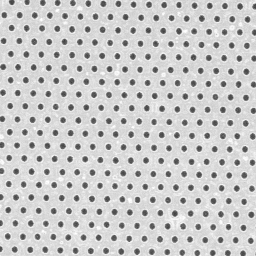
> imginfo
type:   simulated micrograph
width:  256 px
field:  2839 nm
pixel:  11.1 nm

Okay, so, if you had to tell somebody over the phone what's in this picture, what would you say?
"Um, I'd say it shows a regular array of holes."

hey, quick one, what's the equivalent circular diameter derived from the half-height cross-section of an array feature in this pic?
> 6.58 pixels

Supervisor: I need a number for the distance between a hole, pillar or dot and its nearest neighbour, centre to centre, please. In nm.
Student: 163